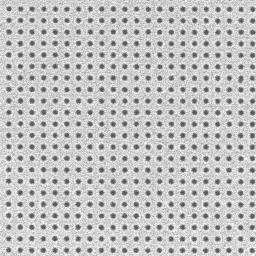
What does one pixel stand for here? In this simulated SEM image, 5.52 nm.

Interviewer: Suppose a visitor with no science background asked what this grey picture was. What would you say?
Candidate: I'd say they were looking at a regular array of holes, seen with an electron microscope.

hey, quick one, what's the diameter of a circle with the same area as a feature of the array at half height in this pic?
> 5.4 pixels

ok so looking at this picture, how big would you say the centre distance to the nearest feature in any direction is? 62.3 nanometers